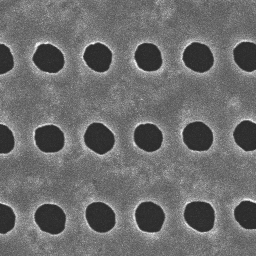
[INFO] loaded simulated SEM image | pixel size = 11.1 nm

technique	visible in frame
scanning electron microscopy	a regular array of holes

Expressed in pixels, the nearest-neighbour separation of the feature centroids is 49.6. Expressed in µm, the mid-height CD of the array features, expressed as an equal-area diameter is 0.34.